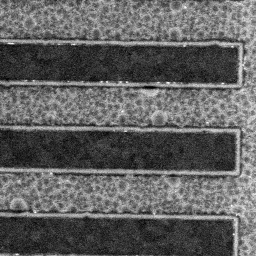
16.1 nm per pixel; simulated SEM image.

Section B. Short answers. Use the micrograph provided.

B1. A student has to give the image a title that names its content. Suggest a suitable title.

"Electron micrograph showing one or a few lines or trenches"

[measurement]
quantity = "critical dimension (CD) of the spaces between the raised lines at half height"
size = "714 nm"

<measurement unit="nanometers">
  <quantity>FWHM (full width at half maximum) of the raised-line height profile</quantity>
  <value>684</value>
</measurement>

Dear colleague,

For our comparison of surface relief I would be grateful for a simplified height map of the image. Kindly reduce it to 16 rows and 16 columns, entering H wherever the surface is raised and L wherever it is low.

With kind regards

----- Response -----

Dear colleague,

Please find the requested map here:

LLLLLLLLLLLLLLLL
LLLLLLLLLLLLLLLL
LLLLLLLLLLLLLLLL
HHHHHHHHHHHHHHHL
HHHHHHHHHHHHHHHL
LLLLLLLLLLLLLLLL
LLLLLLLLLLLLLLLL
LLLLLLLLLLLLLLLL
HHHHHHHHHHHHHHHL
HHHHHHHHHHHHHHHL
HHHHHHHHHHHHHHHL
LLLLLLLLLLLLLLLL
LLLLLLLLLLLLLLLL
HHHHHHHHLLLLLLLL
HHHHHHHHHHHHHHHL
HHHHHHHHHHHHHHHL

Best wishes